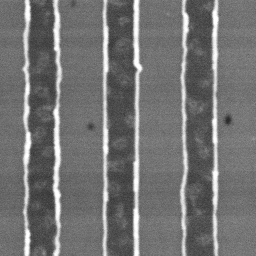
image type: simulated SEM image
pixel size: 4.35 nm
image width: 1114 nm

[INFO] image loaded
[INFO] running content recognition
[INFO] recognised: one or a few lines or trenches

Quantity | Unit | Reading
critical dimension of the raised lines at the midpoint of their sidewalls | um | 0.141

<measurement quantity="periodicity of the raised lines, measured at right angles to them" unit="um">0.343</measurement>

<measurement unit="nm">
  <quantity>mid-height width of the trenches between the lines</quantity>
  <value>201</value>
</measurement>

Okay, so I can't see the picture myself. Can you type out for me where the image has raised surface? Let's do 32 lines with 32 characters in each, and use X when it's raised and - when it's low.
---XXXX------XXXX------XXXX-----
---XXXX------XXXX------XXXX-----
---XXXX------XXXX------XXXX-----
---XXXX------XXXX------XXXX-----
---XXXX------XXXX------XXXX-----
---XXXX------XXXX------XXXX-----
---XXXX------XXXX------XXXX-----
---XXXX------XXXX------XXXX-----
---XXXX------XXXX------XXXX-----
---XXXX------XXXX------XXXX-----
---XXXX------XXXX------XXXX-----
---XXXX------XXXX------XXXX-----
---XXXX------XXXX------XXXX-----
---XXXX------XXXX------XXXX-----
---XXXX------XXXX------XXXX-----
---XXXX------XXXX------XXXX-----
---XXXX------XXXX------XXXX-----
---XXXX------XXXX------XXXX-----
---XXXX------XXXX------XXXX-----
---XXXX------XXXX------XXXX-----
---XXXX------XXXX------XXXX-----
---XXXX------XXXX------XXXX-----
---XXXX------XXXX------XXXX-----
---XXXX------XXXX------XXXX-----
---XXXX------XXXX------XXXX-----
---XXXX------XXXX------XXXX-----
---XXXX------XXXX------XXXX-----
---XXXX------XXXX------XXXX-----
---XXXX------XXXX------XXXX-----
---XXXX------XXXX------XXXX-----
---XXXX------XXXX------XXXX-----
---XXXX------XXXX------XXXX-----